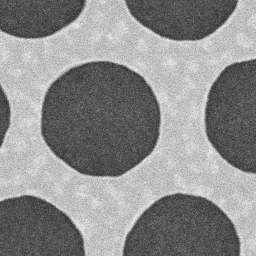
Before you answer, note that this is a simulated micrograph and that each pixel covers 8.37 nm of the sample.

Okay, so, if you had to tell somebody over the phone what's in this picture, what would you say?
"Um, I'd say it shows holes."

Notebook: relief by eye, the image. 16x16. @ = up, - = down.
-----@@@-------@
----@@@@@-----@@
@@@@@@@@@@@-@@@@
@@@@@@@@@@@@@@@@
@@@@----@@@@@@--
@@@------@@@@---
-@@-------@@@---
-@@-------@@@---
@@@-------@@@---
@@@------@@@@@--
@@@@----@@@@@@@-
@@@@@@@@@@@@@@@@
---@@@@@@@---@@@
----@@@@@-----@@
-----@@@-------@
-----@@@-------@